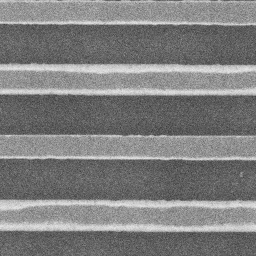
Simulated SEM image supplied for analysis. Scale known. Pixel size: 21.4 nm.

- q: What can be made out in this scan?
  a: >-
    lines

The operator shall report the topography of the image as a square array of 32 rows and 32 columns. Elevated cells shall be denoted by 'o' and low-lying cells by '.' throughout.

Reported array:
oooooooooooooooooooooooooooooooo
oooooooooooooooooooooooooooooooo
oooooooooooooooooooooooooooooooo
................................
................................
................................
................................
................................
oooooooooooo.ooooooooooooo....oo
oooooooooooooooooooooooooooooooo
oooooooooooooooooooooooooooooooo
oooooooooooooooooooooooooooooooo
................................
................................
................................
................................
................................
oooooooooooooooooooooooooooooooo
oooooooooooooooooooooooooooooooo
oooooooooooooooooooooooooooooooo
................................
................................
................................
................................
................................
oooooooooooooooooooooooooooooooo
oooooooooooooooooooooooooooooooo
oooooooooooooooooooooooooooooooo
oooooooooooooooooooooooooooooooo
................................
................................
................................